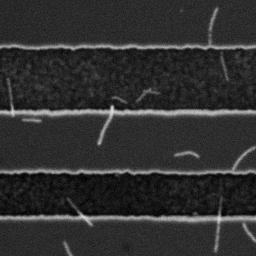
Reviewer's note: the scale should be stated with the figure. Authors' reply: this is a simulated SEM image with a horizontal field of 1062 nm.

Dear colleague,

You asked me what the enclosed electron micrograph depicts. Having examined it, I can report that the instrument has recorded lines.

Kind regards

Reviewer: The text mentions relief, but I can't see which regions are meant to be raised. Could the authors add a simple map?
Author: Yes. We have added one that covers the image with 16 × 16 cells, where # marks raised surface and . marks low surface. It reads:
################
################
################
................
................
................
................
################
################
################
################
................
................
#######.#.......
################
################